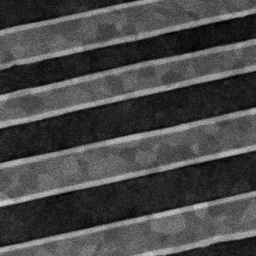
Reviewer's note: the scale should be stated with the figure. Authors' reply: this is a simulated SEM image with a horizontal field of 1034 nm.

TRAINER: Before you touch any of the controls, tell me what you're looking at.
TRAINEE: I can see one or a few lines or trenches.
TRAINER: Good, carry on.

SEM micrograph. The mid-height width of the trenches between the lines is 167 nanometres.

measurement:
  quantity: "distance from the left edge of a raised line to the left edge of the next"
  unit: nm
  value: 286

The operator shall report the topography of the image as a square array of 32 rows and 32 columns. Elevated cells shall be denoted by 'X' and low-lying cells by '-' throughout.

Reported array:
-----------------XXXXXXXXXXXXXXX
------------XXXXXXXXXXXXXXXXXXX-
-------XXXXXXXXXXXXXXXXXXX------
--XXXXXXXXXXXXXXXXXXXX----------
XXXXXXXXXXXXXXXXXX--------------
XXXXXXXXXXXXX-----------------XX
XXXXXXXXX-----------------XXXXXX
XXXX-----------------XXXXXXXXXXX
----------------XXXXXXXXXXXXXXXX
------------XXXXXXXXXXXXXXXX----
--------XXXXXXXXXXXXXXX---------
---XXXXXXXXXXXXXXX--------------
XXXXXXXXXXXXXX------------------
XXXXXXXXXX----------------------
XXXXXX-----------------------XXX
X-----------------------XXXXXXXX
--------------------XXXXXXXXXXXX
---------------XXXXXXXXXXXXXXXXX
----------XXXXXXXXXXXXXXXXXXXXXX
------XXXXXXXXXXXXXXXXXXXXX-----
-XXXXXXXXXXXXXXXXXXXXXX---------
XXXXXXXXXXXXXXXXXX--------------
XXXXXXXXXXXXXX------------------
XXXXXXXXX-----------------------
XXXXX--------------------------X
--------------------------XXXXXX
----------------------XXXXXXXXXX
-----------------XXXXXXXXXXXXXXX
-------------XXXXXXXXXXXXXXXXXXX
---------XXXXXXXXXXXXXXXXXXXXX--
----XXXXXXXXXXXXXXXXXXXXX-------
XXXXXXXXXXXXXXXXXXXX------------